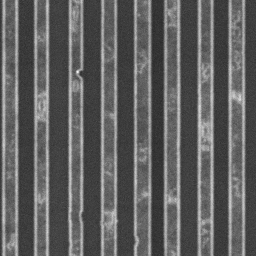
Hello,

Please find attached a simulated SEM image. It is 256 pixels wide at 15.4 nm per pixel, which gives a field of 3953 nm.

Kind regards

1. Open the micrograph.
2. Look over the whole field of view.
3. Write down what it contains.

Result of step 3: parallel lines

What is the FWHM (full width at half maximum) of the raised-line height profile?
193 nanometers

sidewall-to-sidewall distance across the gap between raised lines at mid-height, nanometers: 311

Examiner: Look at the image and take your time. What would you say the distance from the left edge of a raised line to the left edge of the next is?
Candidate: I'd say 499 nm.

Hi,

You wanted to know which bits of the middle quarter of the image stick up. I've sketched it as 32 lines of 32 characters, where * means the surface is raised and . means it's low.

..**......***.....***....****...
..**......***.....***....****...
..**......***.....***....****...
..**......***.....***....****...
..**......***.....***....****...
..**......***.....***....****...
..**......***.....***....****...
..**......***.....***....****...
..**......***.....***....****...
..**......***.....***....****...
..**......***.....***....****...
..**......***.....***....****...
..**......***.....***....****...
..**......***.....***....****...
..**......***.....***....****...
..**......***.....***....****...
..**......***.....***....****...
..**......***.....***....****...
..**......***.....***....****...
..**......***.....***....****...
..**......***.....***....****...
..**......***.....***....****...
..**......***.....***....****...
..**......***.....***....****...
..**......***.....***....****...
..**......***.....***....****...
..**......***.....***....****...
..**......***.....***....****...
..**......***.....***....****...
..**......***.....***....****...
..**......***.....***....****...
..**......***.....***....****...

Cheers